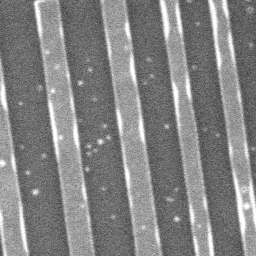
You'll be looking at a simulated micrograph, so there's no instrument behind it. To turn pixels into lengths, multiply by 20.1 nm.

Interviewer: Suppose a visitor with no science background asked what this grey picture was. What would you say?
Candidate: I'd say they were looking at groups of lines, slits or small figures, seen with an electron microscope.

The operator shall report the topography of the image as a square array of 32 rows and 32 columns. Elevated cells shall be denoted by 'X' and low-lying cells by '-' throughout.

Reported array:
-----XX------XXX----XX----XX----
-----XX------XXX-----X-----X----
-----XXX-----XXX-----X-----XX---
-----XXX-----XXX-----XX----XX---
-----XXX-----XXX-----XX----XX---
-----XXX-----XXX-----XX----XX---
-----XXX------XX-----XX----XX---
-----XXX------XX-----XX----XX---
------XX------XXX----XX----XX---
------XXX-----XXX----XX----XXX--
------XXX-----XXX-----X-----XX--
------XXX-----XXX-----XX----XX--
X-----XXX-----XXX-----XX----XX--
X-----XXX------XXX----XX----XX--
X------XX------XXX----XX----XX--
X------XX------XXX----XX----XX--
X------XX------XXX----XXX---XXX-
X------XXX-----XXX-----XX----XX-
XX-----XXX-----XXX-----XX----XX-
XX-----XXX-----XXX-----XX----XX-
XX-----XXX------XX-----XX----XX-
XX-----XXX------XXX----XX----XX-
XX------XX------XXX----XX----XX-
XX------XX------XXX----XX-----X-
XX------XXX-----XXX----XXX----XX
XXX-----XXX-----XXX-----XX----XX
XXX-----XXX-----XXX-----XX----XX
XXX-----XXX------XX-----XX----XX
XXX-----XXX------XXX----XX----XX
XXX-----XXX------XXX----XX----XX
XXX------XXX-----XXX----XX----XX
-XX------XXX-----XXX-----X-----X